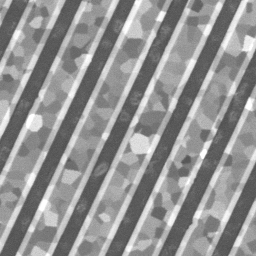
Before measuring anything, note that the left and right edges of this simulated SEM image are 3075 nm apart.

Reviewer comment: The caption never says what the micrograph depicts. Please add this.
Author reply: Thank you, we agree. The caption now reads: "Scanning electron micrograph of parallel lines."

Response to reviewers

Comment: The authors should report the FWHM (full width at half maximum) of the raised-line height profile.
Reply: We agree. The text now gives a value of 341 nm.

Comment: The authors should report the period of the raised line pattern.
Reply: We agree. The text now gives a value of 578 nm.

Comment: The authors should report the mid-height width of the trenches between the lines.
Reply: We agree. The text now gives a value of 242 nm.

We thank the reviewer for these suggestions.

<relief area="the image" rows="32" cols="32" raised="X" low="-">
X---XXXX--XXXX---XXXX---XXXX--XX
X--XXXX---XXXX---XXXX--XXXX---XX
---XXXX--XXXX---XXXX---XXXX--XXX
--XXXX---XXXX---XXXX--XXXX---XXX
--XXXX---XXX---XXXX---XXXX--XXXX
-XXXX---XXXX---XXXX--XXXX---XXXX
-XXXX---XXX---XXXX---XXXX--XXXXX
-XXX---XXXX---XXXX--XXXX---XXXX-
XXXX---XXXX--XXXX---XXXX---XXXX-
XXX---XXXX---XXXX--XXXX---XXXX--
XXX---XXXX--XXXX---XXXX---XXX---
XXX--XXXX---XXXX---XXX---XXXX---
XX---XXXX--XXXX---XXXX---XXXX--X
XX--XXXX---XXXX---XXX---XXXX---X
X---XXXX--XXXX---XXXX---XXXX--XX
X--XXXX---XXXX---XXXX--XXXX---XX
---XXXX--XXXX---XXXX---XXXX---XX
--XXXX---XXXX---XXXX--XXXX---XXX
--XXXX---XXXX--XXXX---XXXX---XXX
-XXXX---XXXX---XXXX--XXXX---XXXX
-XXXX---XXXX--XXXX---XXXX---XXXX
-XXX---XXXX---XXXX--XXXX---XXXX-
XXXX---XXXX--XXXX---XXXX---XXXX-
XXX---XXXX---XXXX--XXXXX--XXXX--
XXX---XXXX--XXXX---XXXX---XXXX--
XXX--XXXX---XXXX---XXXX--XXXX---
XX---XXXX--XXXX---XXXX---XXXX--X
XX--XXXX---XXXX---XXXX--XXXX---X
X---XXXX---XXX---XXXX---XXXX--XX
X--XXXX---XXXX---XXXX--XXXX---XX
---XXXX---XXX---XXXX---XXXX---XX
--XXXX---XXXX---XXXX--XXXX---XXX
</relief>